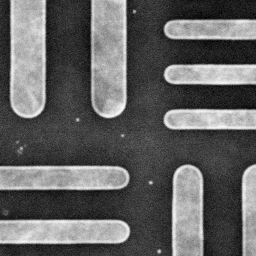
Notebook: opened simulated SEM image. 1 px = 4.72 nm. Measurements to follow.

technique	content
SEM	groups of lines, slits or small figures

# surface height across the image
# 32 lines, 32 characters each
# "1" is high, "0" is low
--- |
00111100000011110000000000000000
00111100000011110000000000000000
00111000000011110000000000000000
00111000000011110000011111111111
00111000000011110000011111111111
00111000000011110000000000000000
00111000000011110000000000000000
00111100000011110000000000000000
00111100000011110000011111111111
00111000000011110000011111111111
00111000000011110000000000000000
01111000000011110000000000000000
01111000000011110000000000000000
00111000000011100000000000000000
00010000000001000000011111111111
00000000000000000000011111111111
00000000000000000000000000000000
00000000000000000000000000000000
00000000000000000000000000000000
00000000000000000000000000000000
00000000000000000000000000000000
11111111111111110000001110000001
11111111111111110000001110000011
11111111111111000000001110000011
00000000000000000000001110000011
00000000000000000000001110000011
00000000000000000000001110000011
00000000000000000000001110000001
11111111111111110000001110000001
11111111111111110000001110000001
00000000000000000000001110000001
00000000000000000000001110000001